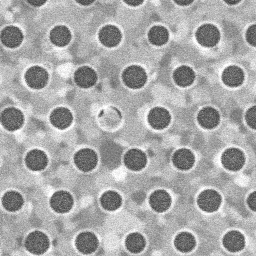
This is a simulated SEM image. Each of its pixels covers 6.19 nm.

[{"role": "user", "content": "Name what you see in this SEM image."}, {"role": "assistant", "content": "a regular array of holes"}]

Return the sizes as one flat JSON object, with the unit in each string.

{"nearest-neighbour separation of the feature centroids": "0.294 micrometres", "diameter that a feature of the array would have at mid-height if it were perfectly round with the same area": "24.7 pixels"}